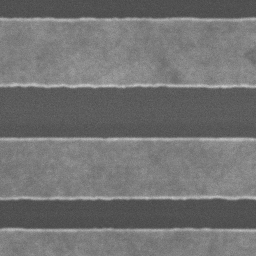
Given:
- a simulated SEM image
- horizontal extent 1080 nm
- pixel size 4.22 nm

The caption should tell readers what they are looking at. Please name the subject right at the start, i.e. lines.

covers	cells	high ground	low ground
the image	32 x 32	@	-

--------------------------------
--------------------------------
@@@@@@@@@@@@@@@@@@@@@@@@@@@@@@@@
@@@@@@@@@@@@@@@@@@@@@@@@@@@@@@@@
@@@@@@@@@@@@@@@@@@@@@@@@@@@@@@@@
@@@@@@@@@@@@@@@@@@@@@@@@@@@@@@@@
@@@@@@@@@@@@@@@@@@@@@@@@@@@@@@@@
@@@@@@@@@@@@@@@@@@@@@@@@@@@@@@@@
@@@@@@@@@@@@@@@@@@@@@@@@@@@@@@@@
@@@@@@@@@@@@@@@@@@@@@@@@@@@@@@@@
@@@@@@@@@@@@@@@@@@@@@@@@@@@@@@@@
--------------------------------
--------------------------------
--------------------------------
--------------------------------
--------------------------------
--------------------------------
@@@@@@@@@@@@@@@@@@@@@@@@@@@@@@@@
@@@@@@@@@@@@@@@@@@@@@@@@@@@@@@@@
@@@@@@@@@@@@@@@@@@@@@@@@@@@@@@@@
@@@@@@@@@@@@@@@@@@@@@@@@@@@@@@@@
@@@@@@@@@@@@@@@@@@@@@@@@@@@@@@@@
@@@@@@@@@@@@@@@@@@@@@@@@@@@@@@@@
@@@@@@@@@@@@@@@@@@@@@@@@@@@@@@@@
@@@@@@@@@@@@@@@@@@@@@@@@@@@@@@@@
--------------------------------
--------------------------------
--------------------------------
--------------------------------
@@@@@@@@@@@@@@@@@@@@@@@@@@@@@@@@
@@@@@@@@@@@@@@@@@@@@@@@@@@@@@@@@
@@@@@@@@@@@@@@@@@@@@@@@@@@@@@@@@